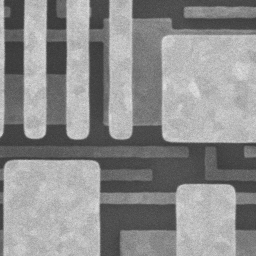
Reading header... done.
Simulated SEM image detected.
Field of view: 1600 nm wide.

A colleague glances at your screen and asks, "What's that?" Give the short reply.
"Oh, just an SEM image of wiring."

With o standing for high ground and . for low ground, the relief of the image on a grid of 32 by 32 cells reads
...ooo..ooo...oo................
...ooo..ooo...oo................
...ooo..ooo...oo................
...ooo..ooo...oo................
...ooo..ooo...oo.....ooooooooooo
...ooo..ooo...oo....oooooooooooo
...ooo..ooo...oo....oooooooooooo
...ooo..ooo...oo....oooooooooooo
...ooo..ooo...oo....oooooooooooo
...ooo..ooo...oo....oooooooooooo
...ooo..ooo...oo....oooooooooooo
...ooo..ooo...oo....oooooooooooo
...ooo..ooo...oo....oooooooooooo
...ooo..ooo...oo....oooooooooooo
...ooo..ooo...oo....oooooooooooo
...ooo..ooo...oo....oooooooooooo
...ooo..ooo...oo....oooooooooooo
.....................ooooooooooo
................................
................................
.ooooooooooo....................
.ooooooooooo....................
.ooooooooooo....................
oooooooooooo..........ooooooo...
oooooooooooo..........ooooooo...
oooooooooooo..........ooooooo...
oooooooooooo..........ooooooo...
oooooooooooo..........ooooooo...
oooooooooooo..........ooooooo...
oooooooooooo..........ooooooo...
oooooooooooo..........ooooooo...
oooooooooooo..........ooooooo...